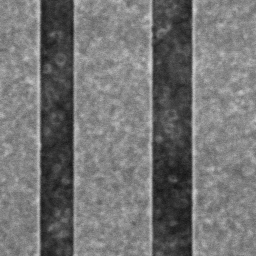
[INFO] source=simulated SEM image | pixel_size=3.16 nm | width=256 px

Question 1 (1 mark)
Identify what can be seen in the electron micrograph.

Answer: one or a few lines or trenches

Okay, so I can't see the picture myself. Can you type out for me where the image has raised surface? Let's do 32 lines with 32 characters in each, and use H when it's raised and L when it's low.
HHHHHLLLLHHHHHHHHHHLLLLLHHHHHHHH
HHHHHLLLLHHHHHHHHHHLLLLLHHHHHHHH
HHHHHLLLLHHHHHHHHHHLLLLLHHHHHHHH
HHHHHLLLLHHHHHHHHHHLLLLLHHHHHHHH
HHHHHLLLLHHHHHHHHHHLLLLLHHHHHHHH
HHHHHLLLLHHHHHHHHHHLLLLLHHHHHHHH
HHHHHLLLLHHHHHHHHHHLLLLLHHHHHHHH
HHHHHLLLLHHHHHHHHHHLLLLLHHHHHHHH
HHHHHLLLLHHHHHHHHHHLLLLLHHHHHHHH
HHHHHLLLLHHHHHHHHHHLLLLLHHHHHHHH
HHHHHLLLLHHHHHHHHHHLLLLLHHHHHHHH
HHHHHLLLLHHHHHHHHHHLLLLLHHHHHHHH
HHHHHLLLLHHHHHHHHHHLLLLLHHHHHHHH
HHHHHLLLLHHHHHHHHHHLLLLLHHHHHHHH
HHHHHLLLLHHHHHHHHHHLLLLLHHHHHHHH
HHHHHLLLLHHHHHHHHHHLLLLLHHHHHHHH
HHHHHLLLLHHHHHHHHHHLLLLLHHHHHHHH
HHHHHLLLLHHHHHHHHHHLLLLLHHHHHHHH
HHHHHLLLLHHHHHHHHHHLLLLLHHHHHHHH
HHHHHLLLLHHHHHHHHHHLLLLLHHHHHHHH
HHHHHLLLLHHHHHHHHHHLLLLLHHHHHHHH
HHHHHLLLLHHHHHHHHHHLLLLLHHHHHHHH
HHHHHLLLLHHHHHHHHHHLLLLLHHHHHHHH
HHHHHLLLLHHHHHHHHHHLLLLLHHHHHHHH
HHHHHLLLLHHHHHHHHHHLLLLLHHHHHHHH
HHHHHLLLLHHHHHHHHHHLLLLLHHHHHHHH
HHHHHLLLLHHHHHHHHHHLLLLLHHHHHHHH
HHHHHLLLLHHHHHHHHHHLLLLLHHHHHHHH
HHHHHLLLLHHHHHHHHHHLLLLLHHHHHHHH
HHHHHLLLLHHHHHHHHHHLLLLLHHHHHHHH
HHHHHLLLLHHHHHHHHHHLLLLLHHHHHHHH
HHHHHLLLLHHHHHHHHHHLLLLLHHHHHHHH